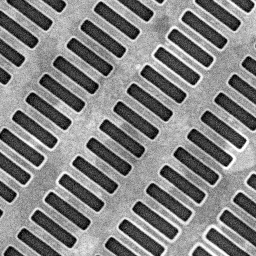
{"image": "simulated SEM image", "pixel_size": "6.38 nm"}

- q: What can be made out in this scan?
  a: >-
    groups of lines, slits or small figures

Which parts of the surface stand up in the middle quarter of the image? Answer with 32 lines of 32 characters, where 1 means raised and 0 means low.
00011110000011111111001110000001
00001111000011111110000111100000
00000111100111111110000011110000
10000001111111111111000000111000
11000000111111111111100000011100
11110000011111110001111000001111
01111000111111110000111100000011
00011111111111110000001110000001
00001111111111111000000111100011
00000111111110011100000011110011
10000111111110001111000001111111
11000111111100000111100000011111
11111111111110000001111000011111
01111111111111000000111100011111
00111111110011110000011110111111
01111111100001111000000111111111
01111111100000011100000011111111
11111111110000001111000011111110
11111110111100000111100111111110
11111100011110000011111111111111
11111000001111000000111111111111
11111100000011100000111111110011
11111111000001111000111111100000
11100111100000111101111111110000
11000011110000001111111111111000
11000000111100000111111110111100
11100000011110000111111100001111
01111000001111001111111100000111
00111100000011111111111110000011
00011110000001111111111111000000
00000111100000111111100011110000
00000011110001111111000001111000